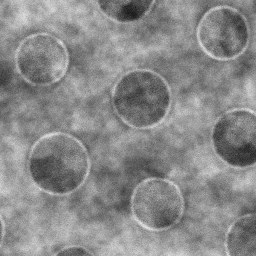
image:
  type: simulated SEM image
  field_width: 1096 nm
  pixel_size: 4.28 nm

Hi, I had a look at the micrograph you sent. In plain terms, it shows raised bodies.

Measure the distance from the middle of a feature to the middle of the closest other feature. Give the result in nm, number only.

452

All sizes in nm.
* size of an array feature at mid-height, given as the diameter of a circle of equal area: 224